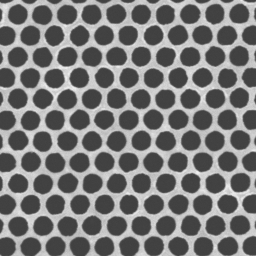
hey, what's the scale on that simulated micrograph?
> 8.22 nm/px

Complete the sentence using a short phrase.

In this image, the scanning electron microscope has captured a regular array of holes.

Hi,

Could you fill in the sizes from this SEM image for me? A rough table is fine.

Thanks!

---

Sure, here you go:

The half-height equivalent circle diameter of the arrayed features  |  0.166 µm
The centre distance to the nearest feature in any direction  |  197 nm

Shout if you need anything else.